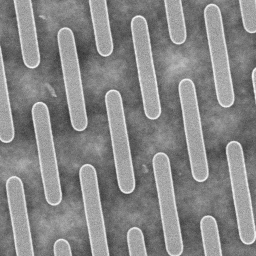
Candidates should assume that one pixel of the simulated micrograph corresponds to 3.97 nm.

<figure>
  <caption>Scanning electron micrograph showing groups of lines, slits or small figures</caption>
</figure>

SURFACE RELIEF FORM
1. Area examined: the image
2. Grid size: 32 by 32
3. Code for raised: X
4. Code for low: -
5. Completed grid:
--XX-------XX--------XX-------XX
--XX-------XX--------XX---X---XX
--XX-------XXX---X---XX---XX--XX
--XX--------XX--XX---XX---XX---X
--XXX--XX---XX---XX--XX---XX----
---XX--XX---XX---XX-------XX----
---XX---XX--XX---XX-------XX----
---XX---XX-------XX-------XXX---
--------XX-------XX--------XX---
X-------XX-------XX--------XX---
X-------XX--------XX---X---XX---
X-------XX----X---XX--XX---XX---
X-------XX---XX---XX---XX--XX---
X---XX---XX--XX---XX---XX-------
X---XX---XX--XXX--XX---XX-------
XX--XX---XX---XX-------XX-------
XX--XX--------XX-------XX-------
X----XX-------XX-------XX-------
-----XX-------XX--------XX--XX--
-----XX-------XX---XX---XX--XX--
-----XX-------XXX--XX---XX---XX-
-----XX---XX---XX--XX---XX---XX-
-XX--XX---XX---XX--XXX-------XX-
-XX---XX--XX---XX---XX-------XX-
-XX---XX--XX--------XX-------XX-
-XX---X---XXX-------XX-------XX-
-XX--------XX-------XX-------XXX
-XXX-------XX-------XX---XX---XX
--XX-------XX-------XXX--XX---XX
--XX-------XX---XX---XX--XX---XX
--XX---XX--XX---XX---XX--XX-----
--XX---XX--XXX--XX---XX---XX----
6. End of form